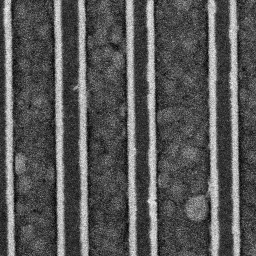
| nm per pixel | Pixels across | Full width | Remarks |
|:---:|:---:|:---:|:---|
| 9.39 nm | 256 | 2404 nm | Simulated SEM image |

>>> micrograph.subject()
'one or a few lines or trenches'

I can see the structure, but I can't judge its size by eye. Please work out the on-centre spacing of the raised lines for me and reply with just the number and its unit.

717 nm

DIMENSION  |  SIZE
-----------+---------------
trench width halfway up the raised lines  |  0.474 microns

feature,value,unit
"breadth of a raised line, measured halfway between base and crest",0.201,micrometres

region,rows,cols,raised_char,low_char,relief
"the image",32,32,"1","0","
10000001110000001110000000111000
10000001110000001110000000111000
10000001110000001110000000011000
10000001110000001110000000011000
10000001110000001110000000011000
10000001110000001110000000011000
10000001110000001110000000011000
10000001110000001110000000011000
10000001110000001110000000011000
10000001110000001110000000011000
10000001110000001110000000011000
10000001110000001110000000011000
10000001110000001110000000011000
10000001110000001110000000011000
10000001110000001110000000011000
10000001110000001110000000011000
10000001110000001110000000011000
10000001110000001110000000011000
10000001110000001110000000011000
10000001110000001110000000011000
10000001110000001110000000011000
10000000110000001110000000011000
10000000110000001110000000011000
10000000110000000110000000011000
10000000110000000110000000011000
10000000110000000110000000011000
10000000110000000110000000011100
10000000111000000110000000011000
10000000111000000110000000011000
10000000111000000110000000011000
10000000111000000110000000011000
10000000111000000110000000011000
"